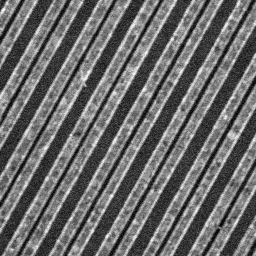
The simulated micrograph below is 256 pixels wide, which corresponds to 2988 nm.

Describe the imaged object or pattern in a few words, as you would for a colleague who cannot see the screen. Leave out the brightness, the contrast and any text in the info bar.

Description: parallel lines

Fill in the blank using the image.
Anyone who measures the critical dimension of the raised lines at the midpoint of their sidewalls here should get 99.3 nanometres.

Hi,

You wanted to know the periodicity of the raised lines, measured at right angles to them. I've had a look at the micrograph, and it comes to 234 nm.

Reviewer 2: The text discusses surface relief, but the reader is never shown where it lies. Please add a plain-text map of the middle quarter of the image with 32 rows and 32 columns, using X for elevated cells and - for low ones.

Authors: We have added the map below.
XXX-XXX-----XX--XX-----XXX--XX--
XX--XXX----XXX--XX-----XX--XX---
X--XXX----XXX--XX-----XXX--XX---
X--XX-----XX--XXX----XXX--XX----
--XXX----XXX--XX-----XX--XXX----
--XX-----XX--XXX----XXX--XX-----
-XXX----XXX--XX-----XX--XXX----X
-XX-----XX--XXX----XXX--XX-----X
XXX----XXX--XX-----XX--XXX----XX
XX----XXX--XX-----XXX--XX-----XX
XX----XXX--XX-----XX--XX-----XXX
X----XXX--XXX----XXX--XX-----XX-
-----XX--XXX----XXX--XX-----XX--
----XXX--XX-----XX--XXX----XXX--
----XX--XXX----XXX--XX-----XX--X
---XXX--XX-----XX--XXX-----XX--X
---XX--XXX----XXX--XX-----XX--XX
--XXX--XX-----XX--XXX----XXX--XX
-XXX--XX-----XXX--XX-----XX--XXX
-XX--XXX----XXX--XX-----XXX--XX-
XXX--XXX----XXX--XX-----XX--XX--
XX--XXX----XXX--XX-----XXX--XX--
XX--XX-----XX--XXX----XXX--XX---
X--XXX----XXX--XX-----XX--XXX---
X--XX-----XX--XXX----XXX--XX----
--XXX----XXX--XX-----XX--XXX----
--XX-----XX--XX-----XXX--XX-----
-XXX----XXX--XX-----XX--XXX----X
XXX----XXX--XX-----XXX--XX-----X
XX-----XX---XX----XXX--XX-----XX
XX----XXX--XX-----XXX--XX-----XX
X-----XX--XXX----XXX--XX-----XX-